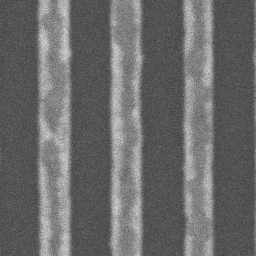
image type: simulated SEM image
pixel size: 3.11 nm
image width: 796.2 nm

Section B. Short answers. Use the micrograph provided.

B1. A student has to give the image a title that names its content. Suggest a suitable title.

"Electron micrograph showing one or a few lines or trenches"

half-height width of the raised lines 82.1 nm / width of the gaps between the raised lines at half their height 140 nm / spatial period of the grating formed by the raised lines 224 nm